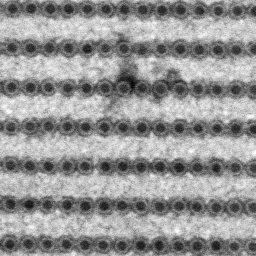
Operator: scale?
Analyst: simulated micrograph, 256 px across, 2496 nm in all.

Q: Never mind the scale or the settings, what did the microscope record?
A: a regular array of raised bodies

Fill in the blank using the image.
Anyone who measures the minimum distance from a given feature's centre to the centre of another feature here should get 181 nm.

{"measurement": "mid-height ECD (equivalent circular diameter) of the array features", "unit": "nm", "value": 126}